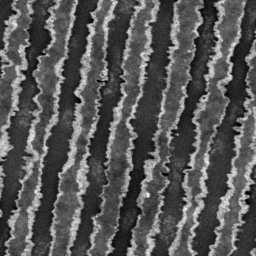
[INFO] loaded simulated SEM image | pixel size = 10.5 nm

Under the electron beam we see parallel lines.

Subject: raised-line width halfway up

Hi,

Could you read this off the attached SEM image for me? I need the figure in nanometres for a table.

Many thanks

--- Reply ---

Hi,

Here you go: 216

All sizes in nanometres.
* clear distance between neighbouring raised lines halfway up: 216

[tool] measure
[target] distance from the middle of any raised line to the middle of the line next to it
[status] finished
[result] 0.427 µm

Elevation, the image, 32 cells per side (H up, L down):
LLHHLLLHHHLLHHLLLLHHLLHHHLLHHHHL
LLHHLLHHHLLLHHLLLHHLLLHHHLLHHHLL
LHHHLLHHHLLLHHLLHHHLLLHHHLLHHHLL
LHHLLLHHHLLHHLLLHHHLLLHHHLLHHHLL
LHHHLLHHHLLHHLLLHHHLLLHHHLLHHHLL
LHHHLLHHLLLHHLLLHHHLLLHHLLLHHHLL
HHHLLLHHLLLHHLLLHHHLLHHHLLLHHLLH
LHHLLHHHLLLHHLLHHHLLLHHHLLLHHLLH
HHHLLHHHLLLHHLLHHHLLLHHHLLHHHLLH
HHHLHHHHLLHHHLLHHHLLLHHHLLHHHLLH
HHLLLHHLLLHHHLLHHHLLLHHLLLHHLLLH
HHLLLHHLLHHHLLLHHHLLHHHLLLHHLLLH
HHLLLHHLLLHHLLLHHLLLHHHLLHHHHLLH
HHLLLHHLLLHHLLLHHLLLHHHLLHHHLLLH
HLLLLHHLLLHHLLLHHLLLHHHLHHHHLLHH
HLLLHHHLLHHHLLHHLLLLHHLLHHHHLLHH
HLLLHHLLLHHHLLHHHLLLHLLLLHHLLLHH
HLLLHHLLLHHLLLHHHLLHHLLLLHHLLHHH
HLLLHHLLLHHLLHHHHLLHHLLLHHLLLLHH
LLLLHHLLLHHLLHHHLLLHHLLLHHLLLLHH
LLLLHLLLHHHLLHHHHLHHHLLLHHLLLHHH
LLLLHLLLHHLLLHHHLLHHHLLHHHLLLHHL
LLLHHLLHHHLLLHHHLLHHHLLHHHLLLHHL
LLLHHLLHHHLLLHHHLLHHHLLHHLLLLHHL
LLHHHLLHHHLLLHHHLLHHLLLHHLLLHHHL
LLHHHLLHHHLLLHHLLLHHLLLHHLLLHHHL
LLHHLLLHHHLLHHHLLLHHLLLHHLLLHHLL
LHHHLLLHHHLLHHHLLHHLLLLHLLLLHHLL
LHHHLLLHHHLLHHHLLHHLLLHHLLLHHLLL
LHHHLLLHHLLLHHLLLHHLLLHHLLLHHLLL
LHHHLLHHHLLLHHLLHHHLLLHHLLLHHLLL
LHHLLLHHHLLHHHLLHHHLLHHHLLHHHLLH